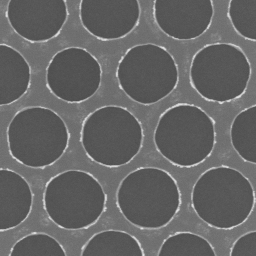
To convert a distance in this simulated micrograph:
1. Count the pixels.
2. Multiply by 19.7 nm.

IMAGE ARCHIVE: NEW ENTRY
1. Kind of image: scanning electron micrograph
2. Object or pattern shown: a regular array of holes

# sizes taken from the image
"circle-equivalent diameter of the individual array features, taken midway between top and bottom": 1160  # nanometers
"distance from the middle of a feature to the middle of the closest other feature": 1420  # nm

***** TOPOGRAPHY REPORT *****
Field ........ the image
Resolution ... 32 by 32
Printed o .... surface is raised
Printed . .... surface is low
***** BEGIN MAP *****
o.......oo.......oo.......ooo...
o.......oo.......oo........oo...
o.......oo.......ooo......ooo...
oo......ooo.....oooo......oooo..
ooo....ooooo...oooooo....ooooo..
ooooooooooooooooooooooooooo.oooo
..ooooo....ooooo.....oooo.....oo
...oooo.....ooo.......oo.......o
....oo......ooo.......oo.......o
....oo.......oo.......oo.......o
....oo......ooo.......oo.......o
...oooo.....oooo.....oooo.....oo
..oooooo..ooooooo...ooooooo.oooo
oooo.oooooooo..ooooooo...oooooo.
oo.....oooo......ooo......oooo..
o.......ooo......ooo.......oo...
o.......oo........o........oo...
o.......oo........o........oo...
o.......ooo......ooo.......oo...
oo......ooo......oooo.....oooo..
ooo...ooooooo..ooooooo..oooooooo
..oooooo..ooooooo....ooooo....oo
...oooo.....ooo.......ooo......o
....oo.......oo.......oo........
....oo.......oo.......oo........
....oo.......oo.......oo........
....oo.......oo.......ooo......o
...oooo.....oooo.....oooo......o
.ooooooo..oooooooooooooooooooooo
oooo..oooooo....oooooo...ooooo..
oo.....oooo......ooo......ooo...
o.......oo........oo.......oo...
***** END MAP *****